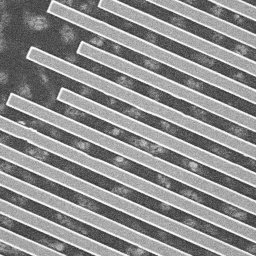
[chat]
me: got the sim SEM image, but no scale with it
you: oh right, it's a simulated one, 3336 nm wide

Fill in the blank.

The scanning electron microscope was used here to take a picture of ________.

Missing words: parallel lines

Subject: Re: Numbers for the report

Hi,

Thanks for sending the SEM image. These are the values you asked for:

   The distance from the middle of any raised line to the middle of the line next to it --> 330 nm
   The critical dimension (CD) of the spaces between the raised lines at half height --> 176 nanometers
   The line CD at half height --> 155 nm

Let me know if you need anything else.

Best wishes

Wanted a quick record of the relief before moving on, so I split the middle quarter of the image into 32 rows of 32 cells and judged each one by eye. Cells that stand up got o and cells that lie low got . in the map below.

ooo........ooooooo.........ooooo
ooooo........oooooooo........ooo
ooooooo.........ooooooo........o
..ooooooo.........ooooooo.......
....oooooooo........ooooooo.....
......oooooooo.........ooooooo..
o........ooooooo.........ooooooo
ooo........ooooooo.........ooooo
ooooo........oooooooo........ooo
ooooooo.........ooooooo.........
..oooooooo........ooooooo.......
.....ooooooo........oooooooo....
.......ooooooo........oooooooo..
o........ooooooo.........ooooooo
ooo........oooooooo........ooooo
ooooo.........ooooooo........ooo
ooooooo.........ooooooo.........
...ooooooo........ooooooo.......
.....ooooooo........oooooooo....
.......ooooooo.....o...ooooooo..
o...o....ooooooo.........ooooooo
ooo.........ooooooo........ooooo
ooooo.........ooooooo.........oo
ooooooo.........ooooooo.........
...ooooooo........ooooooo.......
.....ooooooo.........ooooooo....
.......ooooooo.........ooooooo..
o........oooooooo........ooooooo
ooo.........ooooooo........ooooo
ooooo.........ooooooo.........oo
oooooooo........ooooooo.........
...ooooooo........oooooooo......